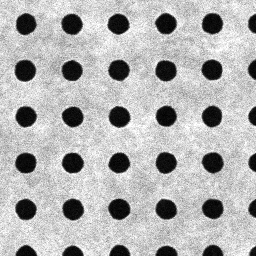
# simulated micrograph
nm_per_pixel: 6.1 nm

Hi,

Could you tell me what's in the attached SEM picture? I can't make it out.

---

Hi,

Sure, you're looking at a regular array of holes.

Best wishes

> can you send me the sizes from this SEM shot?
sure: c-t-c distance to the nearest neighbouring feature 281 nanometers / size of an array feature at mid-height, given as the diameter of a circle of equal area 127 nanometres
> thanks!